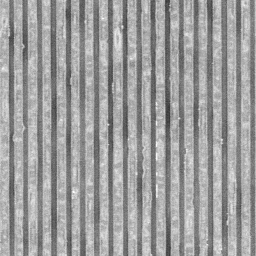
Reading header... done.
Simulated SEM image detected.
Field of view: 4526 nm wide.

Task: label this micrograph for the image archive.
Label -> parallel lines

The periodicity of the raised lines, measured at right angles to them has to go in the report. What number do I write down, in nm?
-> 250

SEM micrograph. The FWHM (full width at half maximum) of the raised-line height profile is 150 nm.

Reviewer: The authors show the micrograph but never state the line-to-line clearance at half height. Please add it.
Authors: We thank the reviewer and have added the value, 106 nanometers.